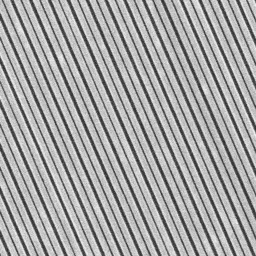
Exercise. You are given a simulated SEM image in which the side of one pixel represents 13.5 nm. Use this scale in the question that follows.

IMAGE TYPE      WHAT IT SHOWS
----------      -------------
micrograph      parallel lines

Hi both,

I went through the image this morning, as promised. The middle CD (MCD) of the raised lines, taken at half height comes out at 0.0697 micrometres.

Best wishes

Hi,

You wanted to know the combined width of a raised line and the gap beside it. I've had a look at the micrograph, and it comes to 116 nanometers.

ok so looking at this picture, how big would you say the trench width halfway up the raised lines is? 3.33 pixels